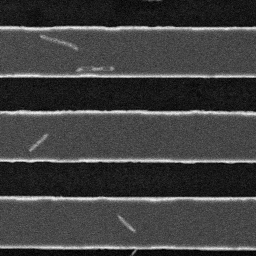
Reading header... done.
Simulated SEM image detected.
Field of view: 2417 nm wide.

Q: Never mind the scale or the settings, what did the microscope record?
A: lines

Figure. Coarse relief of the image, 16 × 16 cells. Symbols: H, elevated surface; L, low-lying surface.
LLLLLLLLLLLLLLLL
LLLLLLLLLLLLLLLL
HHHHHHHHHHHHHHHH
HHHHHHHHHHHHHHHH
HHHHHHHHHHHHHHHH
LLLLLLLLLLLLLLLL
LLLLLLLLLLLLLLLL
HHHHHHHHHHHHHHHH
HHHHHHHHHHHHHHHH
HHHHHHHHHHHHHHHH
LLLLLLLLLLLLLLLL
LLLLLLLLLLLLLLLL
HHHHHHHHHHHHHHHH
HHHHHHHHHHHHHHHH
HHHHHHHHHHHHHHHH
LLLLHHLLHLHHHHHH